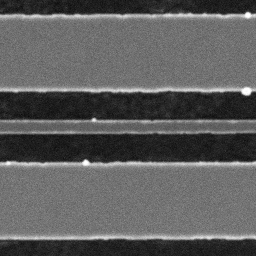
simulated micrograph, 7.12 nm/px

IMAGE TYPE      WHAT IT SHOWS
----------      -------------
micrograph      lines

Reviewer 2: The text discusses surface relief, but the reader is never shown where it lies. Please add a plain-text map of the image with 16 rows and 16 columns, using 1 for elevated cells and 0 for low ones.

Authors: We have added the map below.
0000000000000000
1111111111111111
1111111111111111
1111111111111111
1111111111111111
1111111111111111
0000000000000000
0000010000000000
0000000000000000
0000000000000000
1111111111111111
1111111111111111
1111111111111111
1111111111111111
1111111111111111
0000000000000000